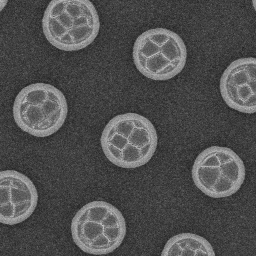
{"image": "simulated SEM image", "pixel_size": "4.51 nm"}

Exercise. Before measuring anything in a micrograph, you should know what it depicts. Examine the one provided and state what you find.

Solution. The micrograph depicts raised bodies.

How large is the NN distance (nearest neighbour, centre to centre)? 419 nanometers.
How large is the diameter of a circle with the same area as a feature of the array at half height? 217 nm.